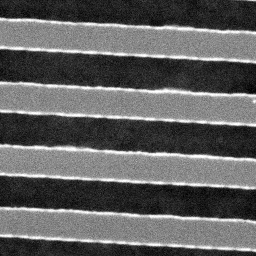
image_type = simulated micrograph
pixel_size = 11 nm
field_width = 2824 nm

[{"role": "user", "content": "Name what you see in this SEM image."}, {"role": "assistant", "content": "lines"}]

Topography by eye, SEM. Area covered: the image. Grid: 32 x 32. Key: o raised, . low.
................................
................................
ooooo...........................
oooooooooooooooooooooo..........
oooooooooooooooooooooooooooooooo
oooooooooooooooooooooooooooooooo
........oooooooooooooooooooooooo
............................oooo
................................
................................
ooooo...........................
ooooooooooooooooooooooo.........
oooooooooooooooooooooooooooooooo
oooooooooooooooooooooooooooooooo
...........ooooooooooooooooooooo
............................oooo
................................
................................
oooooo..........................
oooooooooooooooooooooooo........
oooooooooooooooooooooooooooooooo
oooooooooooooooooooooooooooooooo
............oooooooooooooooooooo
..............................oo
................................
................................
oooooooooooo....................
ooooooooooooooooooooooooooooooo.
oooooooooooooooooooooooooooooooo
oooooooooooooooooooooooooooooooo
................oooooooooooooooo
................................